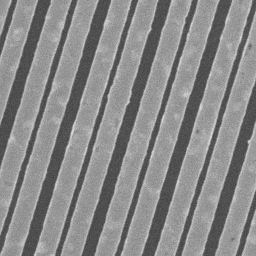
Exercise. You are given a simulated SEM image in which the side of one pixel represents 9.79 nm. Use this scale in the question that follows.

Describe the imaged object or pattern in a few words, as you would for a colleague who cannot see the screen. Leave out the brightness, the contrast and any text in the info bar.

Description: parallel lines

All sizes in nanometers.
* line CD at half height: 186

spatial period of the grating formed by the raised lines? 282 nm